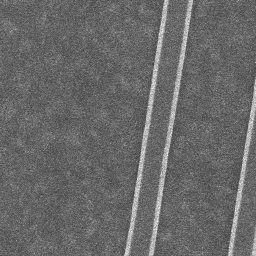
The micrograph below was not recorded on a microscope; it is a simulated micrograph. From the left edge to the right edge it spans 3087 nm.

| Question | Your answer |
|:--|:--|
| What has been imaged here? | one or a few lines or trenches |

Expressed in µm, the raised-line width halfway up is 0.29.